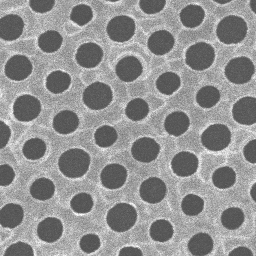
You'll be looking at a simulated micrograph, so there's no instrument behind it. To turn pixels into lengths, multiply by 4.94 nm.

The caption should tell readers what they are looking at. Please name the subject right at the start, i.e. a regular array of holes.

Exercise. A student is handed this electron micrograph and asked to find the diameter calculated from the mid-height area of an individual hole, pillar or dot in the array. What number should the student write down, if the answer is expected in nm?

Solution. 127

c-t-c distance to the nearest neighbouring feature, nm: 202